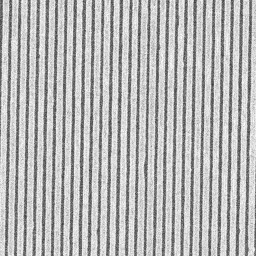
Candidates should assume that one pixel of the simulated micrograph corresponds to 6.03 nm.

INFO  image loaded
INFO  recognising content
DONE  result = parallel lines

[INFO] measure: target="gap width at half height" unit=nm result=25.6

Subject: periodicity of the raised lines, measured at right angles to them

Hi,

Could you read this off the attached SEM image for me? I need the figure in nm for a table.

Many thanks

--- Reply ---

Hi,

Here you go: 55.6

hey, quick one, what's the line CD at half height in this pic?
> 30.9 nanometres